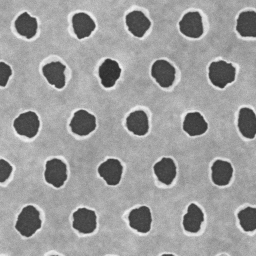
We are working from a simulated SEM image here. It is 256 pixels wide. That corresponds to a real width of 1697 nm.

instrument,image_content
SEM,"a regular array of holes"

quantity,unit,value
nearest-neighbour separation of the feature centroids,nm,363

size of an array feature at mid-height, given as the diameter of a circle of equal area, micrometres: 0.175